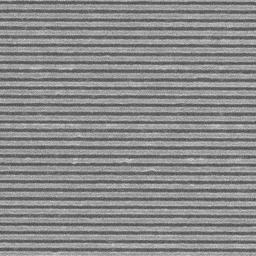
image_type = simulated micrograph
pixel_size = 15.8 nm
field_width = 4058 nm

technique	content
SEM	parallel lines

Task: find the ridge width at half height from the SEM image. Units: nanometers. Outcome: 69.4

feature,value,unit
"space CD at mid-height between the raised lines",0.0694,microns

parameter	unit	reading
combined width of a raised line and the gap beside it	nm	135